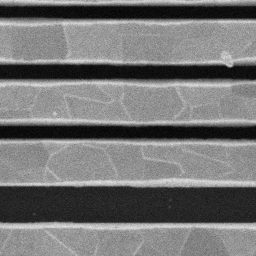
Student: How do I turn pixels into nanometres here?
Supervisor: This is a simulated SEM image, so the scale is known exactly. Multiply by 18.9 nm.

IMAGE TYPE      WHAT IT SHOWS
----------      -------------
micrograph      lines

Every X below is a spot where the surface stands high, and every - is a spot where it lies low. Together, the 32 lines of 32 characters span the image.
----------XXX-------------------
--------------------------------
--------------------------------
XXXXXXXXXXXXXXXXXXXXXXXXXXXXXXXX
XXXXXXXXXXXXXXXXXXXXXXXXXXXXXXXX
XXXXXXXXXXXXXXXXXXXXXXXXXXXXXXXX
XXXXXXXXXXXXXXXXXXXXXXXXXXXXXXXX
XXXXXXXXXXXXXXXXXXXXXXXXXXXXXXXX
--------------------------------
--------------------------------
XXXXXXXXXXXXXXXXXXXXXXXXXXXXXXXX
XXXXXXXXXXXXXXXXXXXXXXXXXXXXXXXX
XXXXXXXXXXXXXXXXXXXXXXXXXXXXXXXX
XXXXXXXXXXXXXXXXXXXXXXXXXXXXXXXX
XXXXXXXXXXXXXXXXXXXXXXXXXXXXXXXX
-------------XXXXXXXXXXX--------
--------------------------------
--------------------------------
XXXXXXXXXXXXXXXXXXXXXXXXXXXXXXXX
XXXXXXXXXXXXXXXXXXXXXXXXXXXXXXXX
XXXXXXXXXXXXXXXXXXXXXXXXXXXXXXXX
XXXXXXXXXXXXXXXXXXXXXXXXXXXXXXXX
XXXXXXXXXXXXXXXXXXXXXXXXXXXXXXXX
--------------------------------
--------------------------------
--------------------------------
--------------------------------
--------------------------------
XXXXXXXXXXXXXXXXXXXXXXXXXXXXXXXX
XXXXXXXXXXXXXXXXXXXXXXXXXXXXXXXX
XXXXXXXXXXXXXXXXXXXXXXXXXXXXXXXX
XXXXXXXXXXXXXXXXXXXXXXXXXXXXXXXX